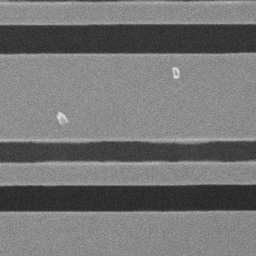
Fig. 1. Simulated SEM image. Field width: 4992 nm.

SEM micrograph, lines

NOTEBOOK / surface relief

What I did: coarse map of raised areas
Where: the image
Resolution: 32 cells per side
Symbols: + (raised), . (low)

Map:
++++++++++++++++++++++++++++++++
++++++++++++++++++++++++++++++++
++++++++++++++++++++++++++++++++
................................
................................
................................
................................
++++++++++++++++++++++++++++++++
++++++++++++++++++++++++++++++++
++++++++++++++++++++++++++++++++
++++++++++++++++++++++++++++++++
++++++++++++++++++++++++++++++++
++++++++++++++++++++++++++++++++
++++++++++++++++++++++++++++++++
++++++++++++++++++++++++++++++++
++++++++++++++++++++++++++++++++
++++++++++++++++++++++++++++++++
++++++++++++++...++++++++++.....
................................
................................
....++++++++++++++++++++++++++++
++++++++++++++++++++++++++++++++
++++++++++++++++++++++++++++++++
................................
................................
................................
........................+.++++++
++++++++++++++++++++++++++++++++
++++++++++++++++++++++++++++++++
++++++++++++++++++++++++++++++++
++++++++++++++++++++++++++++++++
++++++++++++++++++++++++++++++++